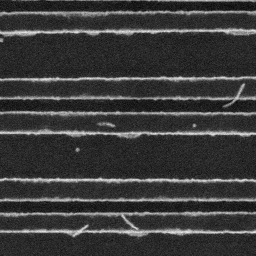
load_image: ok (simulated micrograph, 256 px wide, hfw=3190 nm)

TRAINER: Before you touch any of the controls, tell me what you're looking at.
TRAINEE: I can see lines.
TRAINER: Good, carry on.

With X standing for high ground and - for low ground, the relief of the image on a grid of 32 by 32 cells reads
--------------------------------
---------------X---XXX-XX-XXXXXX
XXXXXXXXXXXXXXXXXXXXXXXXXXXXXXXX
XXXXXXXXXXXXXXXXXXXXXXXXXXXXXXXX
--------------------------------
--------------------------------
--------------------------------
--------------------------------
--------------------------------
--------------------------------
XXXXXXXXXXXXXXXXXXXXXXXXXXXXXXXX
XXXXXXXXXXXXXXXXXXXXXXXXXXXXXXXX
--------------------------------
--------------------------------
XXXXXXXXXXXXXXXXXXXXXXXXXXXXXXXX
XXXXXXXXXXXXXXXXXXXXXXXXXXXXXXXX
XXXXXXXXXXXXXXXXXXXXXXXXXXXXXXXX
--------------------------------
--------------------------------
--------------------------------
--------------------------------
--------------------------------
XXXXXXXXXXXXXX--XX--X---X----XX-
XXXXXXXXXXXXXXXXXXXXXXXXXXXXXXXX
XXXXXXXXXXXXXXXXXXXXXXXXXXXXXXXX
--------------------------------
--------------------------------
XXXXXXXXXXXXXXXXXXXXXXXXXXXXXXXX
XXXXXXXXXXXXXXXXXXXXXXXXXXXXXXXX
--------------------------------
--------------------------------
--------------------------------